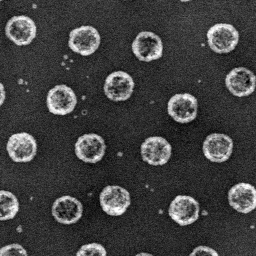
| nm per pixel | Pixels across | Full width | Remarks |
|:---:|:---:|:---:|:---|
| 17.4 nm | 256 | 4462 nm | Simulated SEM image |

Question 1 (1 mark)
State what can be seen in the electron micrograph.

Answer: a regular array of raised bodies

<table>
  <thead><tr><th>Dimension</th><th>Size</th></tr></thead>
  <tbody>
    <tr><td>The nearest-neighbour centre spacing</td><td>887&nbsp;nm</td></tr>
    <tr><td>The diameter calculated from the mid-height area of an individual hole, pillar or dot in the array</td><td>464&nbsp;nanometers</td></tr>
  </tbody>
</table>